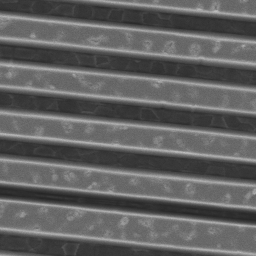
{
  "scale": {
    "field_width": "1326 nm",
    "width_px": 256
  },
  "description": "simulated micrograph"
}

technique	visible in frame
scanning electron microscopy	parallel lines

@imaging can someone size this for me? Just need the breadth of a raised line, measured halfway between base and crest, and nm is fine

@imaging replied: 148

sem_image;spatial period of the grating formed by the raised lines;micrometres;0.242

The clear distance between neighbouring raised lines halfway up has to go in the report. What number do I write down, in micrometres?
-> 0.0986